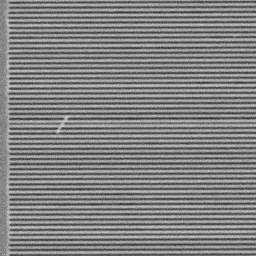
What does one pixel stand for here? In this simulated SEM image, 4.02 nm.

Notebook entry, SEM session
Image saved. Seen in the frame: parallel lines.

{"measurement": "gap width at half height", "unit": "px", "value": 1.87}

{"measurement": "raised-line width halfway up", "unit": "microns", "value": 0.0111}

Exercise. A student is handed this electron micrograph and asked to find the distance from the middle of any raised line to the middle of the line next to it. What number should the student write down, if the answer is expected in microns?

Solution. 0.0203